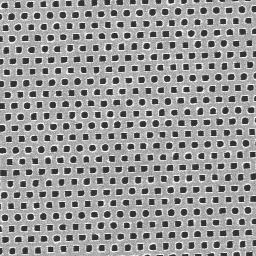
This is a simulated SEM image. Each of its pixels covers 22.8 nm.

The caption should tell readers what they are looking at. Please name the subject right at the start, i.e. a regular array of holes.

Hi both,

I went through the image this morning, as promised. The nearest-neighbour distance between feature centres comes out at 282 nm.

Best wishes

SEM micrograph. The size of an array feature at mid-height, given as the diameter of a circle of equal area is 159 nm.